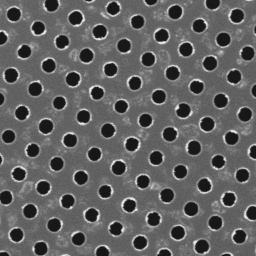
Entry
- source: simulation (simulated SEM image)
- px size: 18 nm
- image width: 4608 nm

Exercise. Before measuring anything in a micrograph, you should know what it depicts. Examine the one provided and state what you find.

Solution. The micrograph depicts a regular array of holes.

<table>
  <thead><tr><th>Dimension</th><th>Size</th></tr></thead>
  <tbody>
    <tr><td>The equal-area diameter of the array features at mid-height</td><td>244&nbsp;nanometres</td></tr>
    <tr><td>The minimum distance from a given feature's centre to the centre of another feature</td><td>27.1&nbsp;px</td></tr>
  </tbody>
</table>